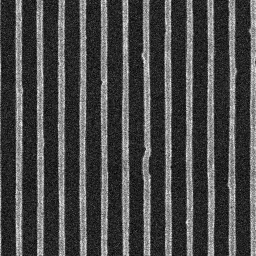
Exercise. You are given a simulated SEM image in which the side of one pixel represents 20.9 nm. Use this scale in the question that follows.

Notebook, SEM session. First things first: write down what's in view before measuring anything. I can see parallel lines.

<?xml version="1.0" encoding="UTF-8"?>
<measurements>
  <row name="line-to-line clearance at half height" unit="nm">303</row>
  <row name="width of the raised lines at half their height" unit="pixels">6.75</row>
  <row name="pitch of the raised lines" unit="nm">446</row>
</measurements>